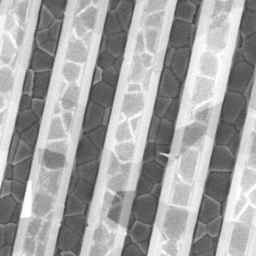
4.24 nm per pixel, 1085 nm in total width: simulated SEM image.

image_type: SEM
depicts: one or a few lines or trenches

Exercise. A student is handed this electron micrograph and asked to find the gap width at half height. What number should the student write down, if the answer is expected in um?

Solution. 0.148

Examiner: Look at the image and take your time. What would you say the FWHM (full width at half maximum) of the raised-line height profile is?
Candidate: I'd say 0.134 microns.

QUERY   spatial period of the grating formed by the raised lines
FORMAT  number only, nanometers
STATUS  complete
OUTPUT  280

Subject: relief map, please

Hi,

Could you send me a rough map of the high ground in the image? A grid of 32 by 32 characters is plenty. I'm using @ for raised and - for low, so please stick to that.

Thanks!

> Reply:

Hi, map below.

@@@@@----@@@@----@@@@-----@@@@--
@@@@-----@@@@----@@@@-----@@@@--
@@@@-----@@@@----@@@@----@@@@@--
@@@@----@@@@-----@@@@----@@@@---
@@@@----@@@@-----@@@@----@@@@---
@@@-----@@@@----@@@@-----@@@@---
@@@-----@@@@----@@@@-----@@@@---
@@@----@@@@-----@@@@----@@@@----
@@@----@@@@-----@@@@----@@@@----
@@@----@@@@----@@@@-----@@@@----
@@-----@@@@----@@@@-----@@@@----
@@-----@@@@----@@@@----@@@@@----
@@----@@@@-----@@@@----@@@@-----
@@----@@@@-----@@@@----@@@@----@
@-----@@@@----@@@@-----@@@@----@
@-----@@@@----@@@@-----@@@@----@
@----@@@@-----@@@@----@@@@-----@
@----@@@@-----@@@@----@@@@-----@
@----@@@@----@@@@-----@@@@----@@
-----@@@@----@@@@----@@@@@----@@
-----@@@@----@@@@-----@@@@----@@
----@@@@-----@@@@----@@@@-----@@
----@@@@-----@@@@----@@@@-----@@
----@@@@----@@@@-----@@@@----@@@
----@@@@----@@@@-----@@@@----@@@
---@@@@@----@@@@----@@@@-----@@@
---@@@@-----@@@@----@@@@-----@@@
---@@@@----@@@@-----@@@@----@@@@
---@@@@----@@@@-----@@@@----@@@@
---@@@@----@@@@-----@@@@----@@@@
--@@@@-----@@@@----@@@@-----@@@@
--@@@@-----@@@@----@@@@-----@@@@